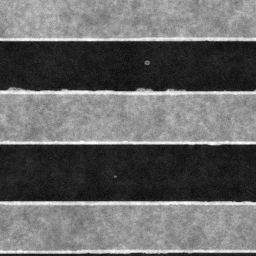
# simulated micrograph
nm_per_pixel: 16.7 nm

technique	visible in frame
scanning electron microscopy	lines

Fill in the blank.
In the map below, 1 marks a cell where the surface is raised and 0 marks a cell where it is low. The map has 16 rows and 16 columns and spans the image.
1111111111111111
1111111111111111
1111111000000000
0000000000000000
0000000000000000
0000000000000000
1111111111111111
1111111111111111
1111111111111111
0000000000000000
0000000000000000
0000000000000000
0000000000000000
1111111111111111
1111111111111111
1111111111111111